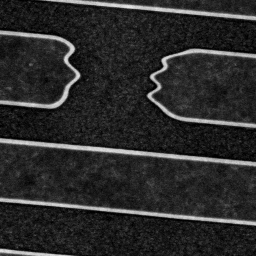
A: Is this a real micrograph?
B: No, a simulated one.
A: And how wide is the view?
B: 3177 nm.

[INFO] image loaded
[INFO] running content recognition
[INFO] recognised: one or a few lines or trenches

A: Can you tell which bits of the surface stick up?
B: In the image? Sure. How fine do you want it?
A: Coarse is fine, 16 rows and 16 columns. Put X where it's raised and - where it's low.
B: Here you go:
---------XXXXXXX
----------------
XXXX------------
XXXX-------XXXXX
XXXXX-----XXXXXX
XXXX------XXXXXX
--X-------XXXXXX
------------XXXX
----------------
XXXXXXXX--------
XXXXXXXXXXXXXXXX
XXXXXXXXXXXXXXXX
XXXXXXXXXXXXXXXX
-----------XXXXX
----------------
----------------